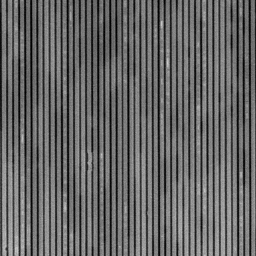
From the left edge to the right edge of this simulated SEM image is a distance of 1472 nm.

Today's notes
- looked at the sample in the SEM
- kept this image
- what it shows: parallel lines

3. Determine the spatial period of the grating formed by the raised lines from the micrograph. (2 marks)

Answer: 0.0349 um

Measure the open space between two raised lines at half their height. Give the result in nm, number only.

14.4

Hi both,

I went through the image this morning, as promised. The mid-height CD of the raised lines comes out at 4.24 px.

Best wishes